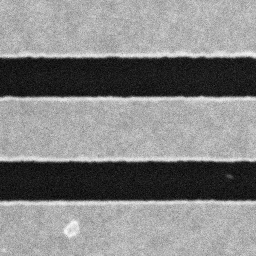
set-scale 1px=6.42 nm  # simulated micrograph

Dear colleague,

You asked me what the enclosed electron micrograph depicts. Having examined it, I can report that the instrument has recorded lines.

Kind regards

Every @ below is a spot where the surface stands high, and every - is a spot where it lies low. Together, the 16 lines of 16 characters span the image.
@@@@@@@@@@@@@@@@
@@@@@@@@@@@@@@@@
@@@@@@@@@@@@@@@@
@@@@@@@@@@@@@@@@
----------------
----------------
@@@@@@@@@@@@@@@@
@@@@@@@@@@@@@@@@
@@@@@@@@@@@@@@@@
@@@@@@@@@@@@@@@@
----------------
----------------
----------------
@@@@@@@@@@@@@@@@
@@@@@@@@@@@@@@@@
@@@@@@@@@@@@@@@@